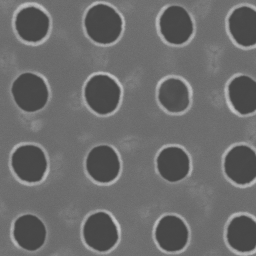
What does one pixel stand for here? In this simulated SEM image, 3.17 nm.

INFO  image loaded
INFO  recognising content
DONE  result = a regular array of holes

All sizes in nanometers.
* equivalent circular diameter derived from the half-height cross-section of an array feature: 111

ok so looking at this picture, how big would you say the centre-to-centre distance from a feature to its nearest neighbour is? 220 nanometers